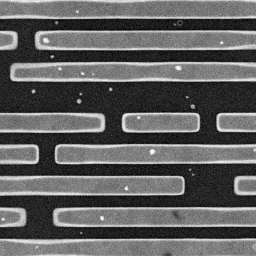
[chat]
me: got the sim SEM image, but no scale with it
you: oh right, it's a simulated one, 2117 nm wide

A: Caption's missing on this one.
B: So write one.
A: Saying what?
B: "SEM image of groups of lines, slits or small figures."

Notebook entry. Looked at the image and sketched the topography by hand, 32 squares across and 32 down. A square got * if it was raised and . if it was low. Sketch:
********************************
********************************
................................
................................
**...***************************
**...***************************
................................
................................
..******************************
.*******************************
................................
................................
................................
................................
*************...*********..*****
*************..**********..*****
................................
................................
*****..*************************
*****..*************************
................................
................................
***********************.......**
***********************......***
................................
................................
***....*************************
***....*************************
................................
................................
********************************
********************************